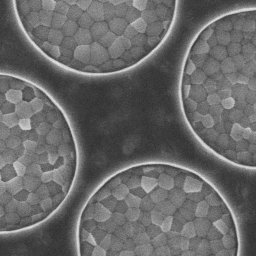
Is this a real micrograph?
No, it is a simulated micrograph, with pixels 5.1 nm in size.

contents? holes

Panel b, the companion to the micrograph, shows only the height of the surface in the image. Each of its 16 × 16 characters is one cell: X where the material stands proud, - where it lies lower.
X----------XXXXX
X----------XX---
XX--------XX----
XXX------XXX----
XXXXX--XXXX-----
--XXXXXXXXX-----
---XXXXXXXX-----
----XXXXXXXX----
-----XXXXXXX----
-----XXXXXXXX---
-----XXX---XXXXX
-----X-------XXX
----XX--------XX
---XX----------X
XXXXX----------X
XXXXX----------X